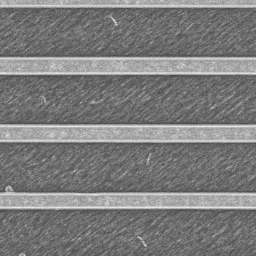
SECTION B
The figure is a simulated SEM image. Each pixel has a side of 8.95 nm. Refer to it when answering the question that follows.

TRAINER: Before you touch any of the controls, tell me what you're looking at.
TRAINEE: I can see one or a few lines or trenches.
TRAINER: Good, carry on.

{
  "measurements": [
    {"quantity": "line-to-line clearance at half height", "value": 453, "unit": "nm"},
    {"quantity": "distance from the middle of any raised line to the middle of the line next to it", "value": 603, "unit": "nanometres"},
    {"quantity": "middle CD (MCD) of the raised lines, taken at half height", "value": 148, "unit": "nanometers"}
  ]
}